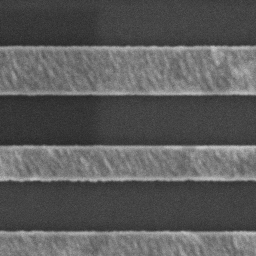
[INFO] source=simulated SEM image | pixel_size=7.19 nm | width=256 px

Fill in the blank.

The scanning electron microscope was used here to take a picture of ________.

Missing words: lines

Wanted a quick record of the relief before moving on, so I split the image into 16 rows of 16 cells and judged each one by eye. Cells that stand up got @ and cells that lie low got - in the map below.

----------------
----------------
----------------
@@@@@@@@@@@@@@@@
@@@@@@@@@@@@@@@@
@@@@@@@@@@@@@@@@
----------------
----------------
----------------
@@@@@@@@@@@@@@@@
@@@@@@@@@@@@@@@@
----------------
----------------
----------------
-@@-----@-@-----
@@@@@@@@@@@@@@@@